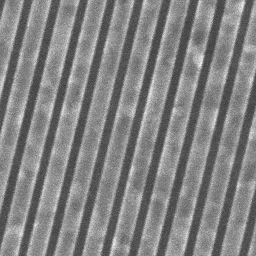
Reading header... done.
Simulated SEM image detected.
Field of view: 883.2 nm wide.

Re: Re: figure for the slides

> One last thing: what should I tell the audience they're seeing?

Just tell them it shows parallel lines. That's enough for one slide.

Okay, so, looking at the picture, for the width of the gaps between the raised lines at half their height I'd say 36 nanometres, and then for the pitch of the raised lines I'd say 92.7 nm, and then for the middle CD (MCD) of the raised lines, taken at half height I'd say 57.4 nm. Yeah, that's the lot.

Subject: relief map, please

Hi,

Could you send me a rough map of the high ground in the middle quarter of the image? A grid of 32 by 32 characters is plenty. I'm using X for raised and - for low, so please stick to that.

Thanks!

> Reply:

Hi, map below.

--XXXX---XXXX---XXXX---XXXX---XX
--XXXX---XXXX---XXXX---XXXX---XX
--XXXX---XXXX---XXXX---XXXX--XXX
--XXXX---XXXX--XXXXX--XXXXX--XXX
-XXXXX--XXXX---XXXX---XXXX---XXX
-XXXX---XXXX---XXXX---XXXX---XXX
-XXXX---XXXX---XXXX---XXXX--XXXX
-XXXX---XXXX---XXXX--XXXXX--XXXX
XXXXX--XXXXX--XXXX---XXXX---XXXX
XXXX---XXXX---XXXX---XXXX---XXXX
XXXX---XXXX---XXXX---XXXX--XXXXX
XXXX---XXXX---XXXX---XXXX--XXXX-
XXXX--XXXXX--XXXXX--XXXX---XXXX-
XXX---XXXX---XXXX---XXXX---XXXX-
XXX---XXXX---XXXX---XXXX---XXXX-
XXX---XXXX---XXXX---XXXX--XXXX--
XXX--XXXXX--XXXXX--XXXXX--XXXX--
XX---XXXX---XXXX---XXXX---XXXX--
XX---XXXX---XXXX---XXXX---XXXX--
XX---XXXX---XXXX---XXXX--XXXXX--
XX--XXXXX--XXXXX--XXXXX--XXXX---
X---XXXX---XXXX---XXXX---XXXX---
X---XXXX---XXXX---XXXX---XXXX---
X---XXXX---XXXX---XXXX--XXXXX--X
X--XXXXX--XXXXX--XXXXX--XXXX---X
---XXXX---XXXX---XXXX---XXXX---X
---XXXX---XXXX---XXXX---XXXX---X
---XXXX---XXXX---XXXX--XXXXX--XX
--XXXXX--XXXXX--XXXXX--XXXX---XX
--XXXX---XXXX---XXXX---XXXX---XX
--XXXX---XXXX---XXXX---XXXX---XX
--XXXX---XXXX---XXXX--XXXXX--XXX